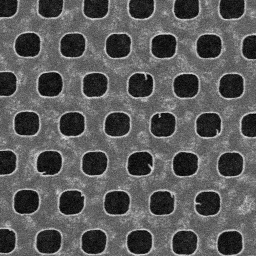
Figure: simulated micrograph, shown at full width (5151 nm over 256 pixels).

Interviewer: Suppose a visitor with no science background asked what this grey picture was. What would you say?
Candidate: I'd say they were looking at a regular array of holes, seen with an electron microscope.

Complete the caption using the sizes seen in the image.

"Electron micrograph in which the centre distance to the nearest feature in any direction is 906 nm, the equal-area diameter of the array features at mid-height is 525 nm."